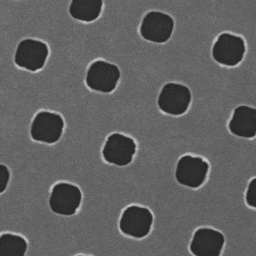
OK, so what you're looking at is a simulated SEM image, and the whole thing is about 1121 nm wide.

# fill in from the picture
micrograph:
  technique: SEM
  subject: a regular array of holes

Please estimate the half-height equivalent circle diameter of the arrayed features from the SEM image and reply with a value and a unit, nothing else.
141 nm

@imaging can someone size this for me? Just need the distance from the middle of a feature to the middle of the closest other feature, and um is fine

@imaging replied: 0.323